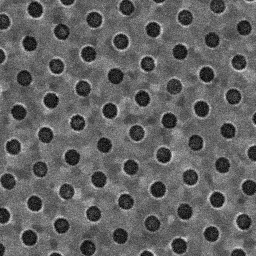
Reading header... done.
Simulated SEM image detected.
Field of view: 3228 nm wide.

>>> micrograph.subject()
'a regular array of holes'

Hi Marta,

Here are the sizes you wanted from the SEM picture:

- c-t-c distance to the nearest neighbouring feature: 34.3 pixels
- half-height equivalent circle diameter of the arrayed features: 16.4 px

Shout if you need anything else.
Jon